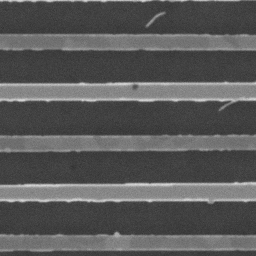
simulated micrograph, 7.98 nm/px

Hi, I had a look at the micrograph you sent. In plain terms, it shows lines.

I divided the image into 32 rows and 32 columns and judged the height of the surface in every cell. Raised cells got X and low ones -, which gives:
--------------------------------
--------------------------------
--------------------------------
--------------------------------
XXXXXXXXXXXXXXXXXXXXXXXXXXXXXXXX
XXXXXXXXXXXXXXXXXXXXXXXXXXXXXXXX
--------------------------------
--------------------------------
--------------------------------
--------------------------------
----------X---XXXXXXXXXXXXXXXXXX
XXXXXXXXXXXXXXXXXXXXXXXXXXXXXXXX
XXXX-X----XX-----XX--XX-XX-XXX--
--------------------------------
--------------------------------
--------------------------------
--------------------------------
XXXXXXXXXXXXXXXXXXXXXXXXXXXXXXXX
XXXXXXXXXXXXXXXXXXXXXXXXXXXXXXXX
--------------------------------
--------------------------------
--------------------------------
--------------------------------
XXXXXXXXXXXXXXXXXXXXXXXXXXXXXXXX
XXXXXXXXXXXXXXXXXXXXXXXXXXXXXXXX
--------------------------------
--------------------------------
--------------------------------
--------------------------------
XXXXXXXXXXXXXXXXXXXXXXXXXXXXXXXX
XXXXXXXXXXXXXXXXXXXXXXXXXXXXXXXX
--------------------------------